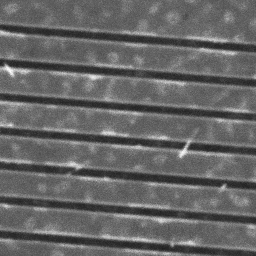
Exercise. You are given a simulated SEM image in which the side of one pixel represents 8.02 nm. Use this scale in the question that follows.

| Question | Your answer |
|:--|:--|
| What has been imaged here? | parallel lines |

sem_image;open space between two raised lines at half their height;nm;72.9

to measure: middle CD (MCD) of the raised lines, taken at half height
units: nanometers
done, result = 204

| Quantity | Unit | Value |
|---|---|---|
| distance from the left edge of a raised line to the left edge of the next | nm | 274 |